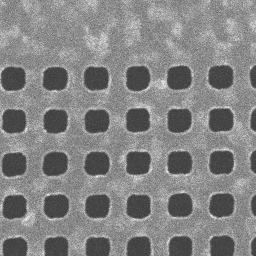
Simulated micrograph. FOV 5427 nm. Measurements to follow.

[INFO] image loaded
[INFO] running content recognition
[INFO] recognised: a regular array of holes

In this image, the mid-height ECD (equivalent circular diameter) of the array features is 558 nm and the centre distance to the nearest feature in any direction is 875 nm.